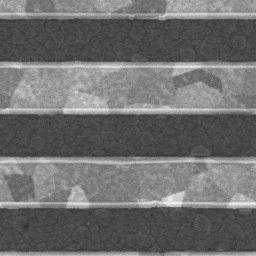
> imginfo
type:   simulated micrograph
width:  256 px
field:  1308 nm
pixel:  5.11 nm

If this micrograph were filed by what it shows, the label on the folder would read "one or a few lines or trenches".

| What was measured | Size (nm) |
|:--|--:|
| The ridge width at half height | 215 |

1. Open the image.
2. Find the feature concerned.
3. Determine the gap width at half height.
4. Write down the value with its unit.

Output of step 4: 0.271 um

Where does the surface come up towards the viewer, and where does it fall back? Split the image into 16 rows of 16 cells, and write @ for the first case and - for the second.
@@@@@@@@@@@@@@@@
----------------
----------------
----------------
@@@@@@@@@@@@@@@@
@@@@@@@@@@@@@@@@
@@@@@@@@@@@@@@@@
----------------
----------------
----------------
@@@@@@@@@@@@@@@@
@@@@@@@@@@@@@@@@
@@@@@@@@@@@@@@@@
----------------
----------------
----------------